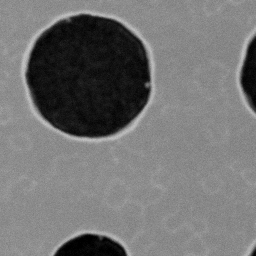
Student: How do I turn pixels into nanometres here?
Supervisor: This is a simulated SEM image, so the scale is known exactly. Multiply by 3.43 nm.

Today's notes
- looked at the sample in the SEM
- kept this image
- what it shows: holes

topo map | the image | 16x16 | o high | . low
oooooooooooooooo
ooo.....oooooooo
oo.......ooooooo
oo.......oooooo.
oo.......oooooo.
oo.......oooooo.
oo.......ooooooo
ooo.....oooooooo
ooooo..ooooooooo
oooooooooooooooo
oooooooooooooooo
oooooooooooooooo
oooooooooooooooo
oooooooooooooooo
oooooooooooooooo
oooo....oooooooo